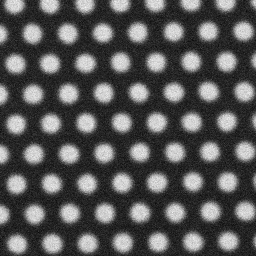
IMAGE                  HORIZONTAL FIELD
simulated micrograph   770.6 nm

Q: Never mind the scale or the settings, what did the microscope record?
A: a regular array of raised bodies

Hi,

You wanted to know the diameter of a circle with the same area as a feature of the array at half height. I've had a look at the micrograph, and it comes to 54.5 nanometers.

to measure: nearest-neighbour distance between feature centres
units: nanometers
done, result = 104